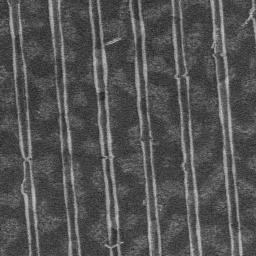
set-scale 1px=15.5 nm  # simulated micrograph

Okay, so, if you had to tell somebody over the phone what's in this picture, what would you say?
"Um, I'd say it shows parallel lines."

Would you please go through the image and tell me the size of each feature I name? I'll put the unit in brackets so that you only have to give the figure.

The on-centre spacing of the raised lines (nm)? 625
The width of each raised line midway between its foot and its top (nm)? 124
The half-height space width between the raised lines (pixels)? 32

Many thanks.